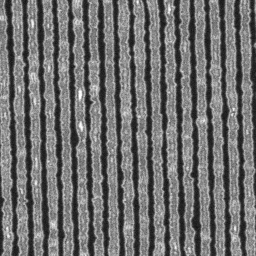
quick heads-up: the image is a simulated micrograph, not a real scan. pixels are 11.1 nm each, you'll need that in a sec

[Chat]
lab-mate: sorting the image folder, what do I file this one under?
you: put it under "parallel lines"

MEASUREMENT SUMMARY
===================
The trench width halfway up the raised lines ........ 76.6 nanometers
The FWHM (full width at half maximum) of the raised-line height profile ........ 86.3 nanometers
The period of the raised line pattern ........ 169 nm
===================